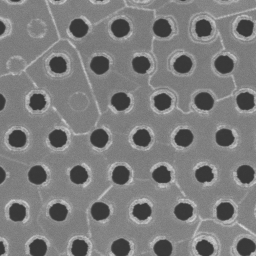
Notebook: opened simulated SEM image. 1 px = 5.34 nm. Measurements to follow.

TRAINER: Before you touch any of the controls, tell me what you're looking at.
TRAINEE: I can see a regular array of holes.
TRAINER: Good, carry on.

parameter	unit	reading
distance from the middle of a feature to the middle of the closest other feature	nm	221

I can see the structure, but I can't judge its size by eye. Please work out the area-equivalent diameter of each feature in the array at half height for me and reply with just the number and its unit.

97.3 nm